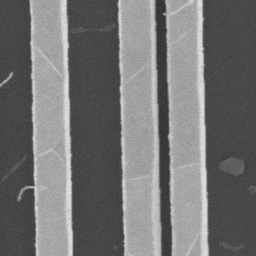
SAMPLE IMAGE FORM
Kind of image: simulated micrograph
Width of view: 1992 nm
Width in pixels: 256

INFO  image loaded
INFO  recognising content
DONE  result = lines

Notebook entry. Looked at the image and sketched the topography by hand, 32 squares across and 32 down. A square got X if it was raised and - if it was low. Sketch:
----XXXX-------XXXX--XXXX-------
----XXXX-------XXXX--XXXX-------
----XXXX-------XXXX--XXXX-------
----XXXX-------XXXX--XXXX-------
----XXXX-------XXXX--XXXX-------
----XXXX-------XXXX--XXXX-------
----XXXX-------XXXX--XXXX-------
----XXXX-------XXXX--XXXX-------
----XXXX-------XXXX--XXXX-------
----XXXX-------XXXX--XXXX-------
----XXXX-------XXXX--XXXX-------
----XXXX-------XXXX--XXXX-------
----XXXX-------XXXX--XXXX-------
----XXXX-------XXXX--XXXX-------
----XXXX-------XXXX--XXXX-------
----XXXX-------XXXX--XXXX-------
----XXXX-------XXXXX-XXXX-------
----XXXX-------XXXXX-XXXX-------
----XXXXX------XXXXX-XXXX-------
----XXXXX------XXXXX-XXXX-------
----XXXXX------XXXXX-XXXX---X---
----XXXXX------XXXX--XXXX-------
----XXXXX------XXXX--XXXX-------
----XXXXX-------XXX--XXXX-------
----XXXXX-------XXX--XXXX-------
----XXXXX-------XXX--XXXXX------
-----XXXX-------XXX--XXXXX------
-----XXXX-------XXXX-XXXXX------
-----XXXX-------XXXX--XXXX------
-----XXXX-------XXXX--XXXX------
-----XXXX-------XXXX--XXXX------
-----XXXX-------XXXX--XXXX------